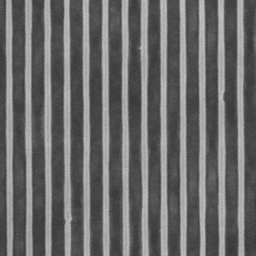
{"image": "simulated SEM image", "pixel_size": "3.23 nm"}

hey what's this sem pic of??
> parallel lines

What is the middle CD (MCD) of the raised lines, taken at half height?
17.7 nm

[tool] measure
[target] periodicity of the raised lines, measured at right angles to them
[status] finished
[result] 0.0622 micrometres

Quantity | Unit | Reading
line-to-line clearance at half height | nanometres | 44.8